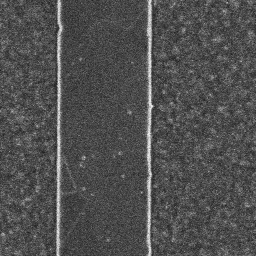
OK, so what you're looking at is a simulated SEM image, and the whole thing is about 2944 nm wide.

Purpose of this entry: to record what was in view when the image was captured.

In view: one or a few lines or trenches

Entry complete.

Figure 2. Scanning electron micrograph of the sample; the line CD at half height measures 1.05 microns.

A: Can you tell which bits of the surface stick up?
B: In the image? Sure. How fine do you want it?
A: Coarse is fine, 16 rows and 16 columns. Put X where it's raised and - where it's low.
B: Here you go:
----XXXXX-------
----XXXXX-------
----XXXXX-------
----XXXXX-------
----XXXXX-------
----XXXXX-------
----XXXXX-------
----XXXXX-------
----XXXXX-------
----XXXXX-------
----XXXXX-------
----XXXXX-------
----XXXXX-------
----XXXXX-------
----XXXXX-------
----XXXXX-------